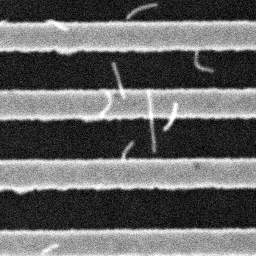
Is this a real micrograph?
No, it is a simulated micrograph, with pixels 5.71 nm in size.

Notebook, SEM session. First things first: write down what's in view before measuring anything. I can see lines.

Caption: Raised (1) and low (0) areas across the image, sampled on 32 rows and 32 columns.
00000000000000000000000000000000
00000000000000000000000000000000
00000000000000000000000000000000
11111111111111111111111111111111
11111111111111111111111111111111
11111111111111111111111111111111
00000000000000000000000000000000
00000000000000000000000000000000
00000000000000000000000000000000
00000000000000000000000000000000
00000000000000000000000000000000
11111111111111111111111111111111
11111111111111111111111111111111
11111111111111111111111111111111
11111111111111111111111111111111
00000000000000000000000000000000
00000000000000000000000000000000
00000000000000000000000000000000
00000000000000000000000000000000
00000000000000000000000000000000
11111111111111111111111111111111
11111111111111111111111111111111
11111111111111111111111111111111
11111101110001010000100000000000
00000000000000000000000000000000
00000000000000000000000000000000
00000000000000000000000000000000
00000000000000000000000000000000
00000000000000000000000000000000
11111111111111111111111111111111
11111111111111111111111111111111
11111111111111111111111111111111